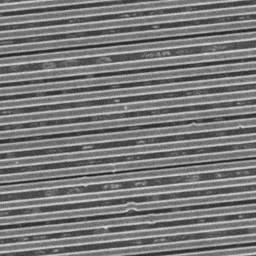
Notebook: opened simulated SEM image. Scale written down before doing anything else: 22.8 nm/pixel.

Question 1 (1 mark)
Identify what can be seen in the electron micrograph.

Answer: parallel lines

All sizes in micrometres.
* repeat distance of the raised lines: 0.324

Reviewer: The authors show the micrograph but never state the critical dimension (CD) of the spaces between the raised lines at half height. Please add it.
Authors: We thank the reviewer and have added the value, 156 nanometers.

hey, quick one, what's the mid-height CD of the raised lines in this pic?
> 173 nanometres